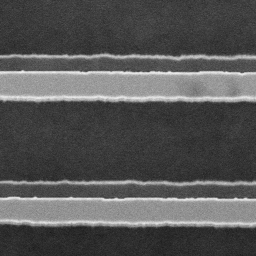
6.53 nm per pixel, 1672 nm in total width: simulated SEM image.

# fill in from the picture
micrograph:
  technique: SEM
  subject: lines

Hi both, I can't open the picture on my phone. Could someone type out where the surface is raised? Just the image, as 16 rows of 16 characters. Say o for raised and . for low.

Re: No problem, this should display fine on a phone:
................
................
................
................
oooooooooooooooo
oooooooooooooooo
................
................
................
................
................
ooooooooooo.oooo
oooooooooooooooo
oooooooooooooooo
................
................